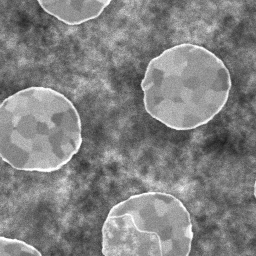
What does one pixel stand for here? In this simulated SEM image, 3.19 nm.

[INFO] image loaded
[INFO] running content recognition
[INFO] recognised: raised bodies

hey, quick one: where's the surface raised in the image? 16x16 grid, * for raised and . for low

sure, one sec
...****.........
................
................
..........***...
.........*****..
..*......*****..
****.....*****..
*****.....***...
*****...........
*****...........
.**.............
................
........***.....
.......*****....
......******....
**....******....